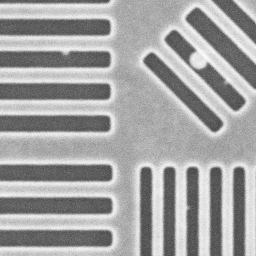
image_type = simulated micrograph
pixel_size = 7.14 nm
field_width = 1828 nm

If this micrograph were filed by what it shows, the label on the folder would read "groups of lines, slits or small figures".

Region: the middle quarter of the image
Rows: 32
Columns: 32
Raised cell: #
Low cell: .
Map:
............########......#####.
#####################......#####
######################......####
#######################......###
########################......##
............#############......#
............##############......
............###############.....
............################....
#############################...
##############################..
###############################.
....############################
............####################
............####################
............####################
............####################
################################
################################
################################
################################
################################
################################
################################
################################
............########.#####.#####
............#######...###...###.
............#######...###...##..
............#######...###...##..
...........########...###...##..
###################...###...##..
###################...###...##..